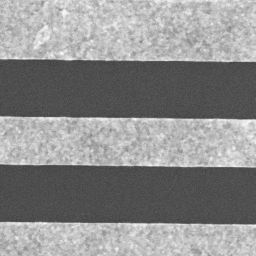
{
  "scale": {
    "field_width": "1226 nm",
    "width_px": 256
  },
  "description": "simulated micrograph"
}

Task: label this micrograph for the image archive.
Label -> wiring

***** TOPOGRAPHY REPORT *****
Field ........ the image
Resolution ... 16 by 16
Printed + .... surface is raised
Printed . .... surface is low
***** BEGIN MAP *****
++++++++++++++++
++++++++++++++++
++++++++++++++++
++++++++++++++++
................
................
................
++++++++++++++..
++++++++++++++++
++++++++++++++++
................
................
................
................
++++++++++++++++
++++++++++++++++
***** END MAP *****